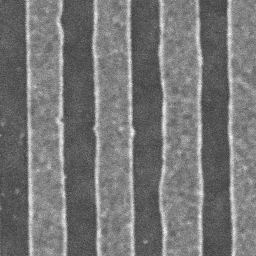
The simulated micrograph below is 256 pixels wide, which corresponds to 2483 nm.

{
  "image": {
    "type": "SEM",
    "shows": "one or a few lines or trenches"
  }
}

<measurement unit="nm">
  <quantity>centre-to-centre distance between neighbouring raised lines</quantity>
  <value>657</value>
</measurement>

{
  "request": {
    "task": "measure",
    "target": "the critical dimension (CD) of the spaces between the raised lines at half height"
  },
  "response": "319 nm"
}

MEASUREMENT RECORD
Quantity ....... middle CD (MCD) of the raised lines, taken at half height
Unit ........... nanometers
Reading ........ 337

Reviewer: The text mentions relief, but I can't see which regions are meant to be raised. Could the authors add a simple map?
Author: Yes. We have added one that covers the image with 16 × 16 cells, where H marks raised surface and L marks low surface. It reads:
LLHHLLHHLLHHLLHH
LLHHLLHHLLHHLLHH
LLHHLLHHLLHHLLHH
LLHHLLHHLLHHHLHH
LLHHLLHHLLHHHLHH
LLHHLLHHLLHHLLHH
LLHHLLHHLLHHLLHH
LLHHLLHHLLHHLLHH
LLHHLLHHLLHHLLHH
LLHHLLHHLLHHLLHH
LLHHLLHHLLHHHLHH
LLHHLLHHLLHHHLHH
LLHHLLHHLLHHHLLH
LLHHLLHHLLHHHLLH
LLHHLLHHLLHHHLLH
LLHHLLHHLLHHHLLH